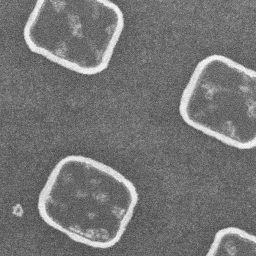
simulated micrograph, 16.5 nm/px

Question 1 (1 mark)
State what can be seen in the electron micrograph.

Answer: raised bodies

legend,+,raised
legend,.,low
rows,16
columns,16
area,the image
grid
..+++++.........
..+++++.........
..+++++.........
...++++.........
............++++
............++++
............++++
............++++
..............++
................
....++..........
...+++++........
...+++++........
...+++++........
....++++......+.
.............+++